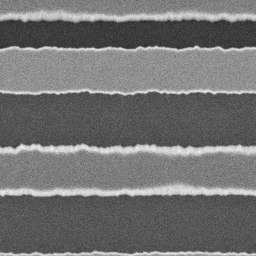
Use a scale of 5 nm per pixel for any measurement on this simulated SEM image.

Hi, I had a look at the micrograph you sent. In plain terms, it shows lines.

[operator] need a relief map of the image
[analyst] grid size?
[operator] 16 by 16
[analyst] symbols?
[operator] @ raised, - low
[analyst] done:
@@@@@@@@@@@@@@@@
----------------
----------------
@@@@@@@@@@@@@@@@
@@@@@@@@@@@@@@@@
@@@@@@@@@@@@@@@@
----------------
----------------
----------------
@@@@@@@@@@@@@@@@
@@@@@@@@@@@@@@@@
@@@@@@@@@@@@@@@@
----------------
----------------
----------------
----------------